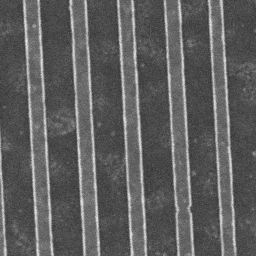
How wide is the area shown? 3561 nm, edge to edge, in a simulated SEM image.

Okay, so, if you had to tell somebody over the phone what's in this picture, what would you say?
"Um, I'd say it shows parallel lines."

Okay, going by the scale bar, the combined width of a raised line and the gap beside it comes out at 639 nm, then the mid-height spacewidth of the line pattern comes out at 448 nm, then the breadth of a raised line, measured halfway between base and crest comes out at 200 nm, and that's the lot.